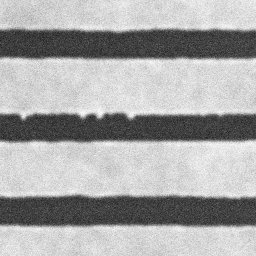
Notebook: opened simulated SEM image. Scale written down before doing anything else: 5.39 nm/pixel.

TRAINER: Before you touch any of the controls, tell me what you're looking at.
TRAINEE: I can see lines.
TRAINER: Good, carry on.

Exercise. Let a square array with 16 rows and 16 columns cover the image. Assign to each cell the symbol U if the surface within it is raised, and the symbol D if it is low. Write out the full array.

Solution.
UUUUUUUUUUUUUUUU
UUUUUUUUUUUUUUUU
DDDDDDDDDDDDDDDD
DDDDDDDDDDDDDDDD
UUUUUUUUUUUUUUUU
UUUUUUUUUUUUUUUU
UUUUUUUUUUUUUUUU
DDDDDDDDDDDDDDDD
DDDDDDDDDDDDDDDD
UUUUUUUUUUUUUUUU
UUUUUUUUUUUUUUUU
UUUUUUUUUUUUUUUU
DDDDDDDDDDDDDDDD
DDDDDDDDDDDDDDDD
UUUUUUUUUUUUUUUU
UUUUUUUUUUUUUUUU